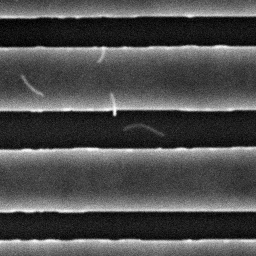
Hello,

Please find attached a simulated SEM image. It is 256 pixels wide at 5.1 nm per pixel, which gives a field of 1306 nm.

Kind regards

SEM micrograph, lines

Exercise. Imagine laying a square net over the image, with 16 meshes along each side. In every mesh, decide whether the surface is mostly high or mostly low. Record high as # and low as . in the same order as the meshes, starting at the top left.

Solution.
################
................
................
################
################
################
################
................
................
################
################
################
################
................
................
################